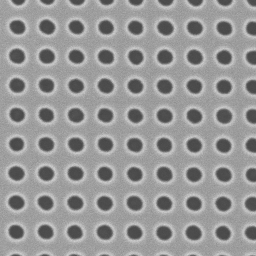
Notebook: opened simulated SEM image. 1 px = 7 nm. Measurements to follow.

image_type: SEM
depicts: a regular array of holes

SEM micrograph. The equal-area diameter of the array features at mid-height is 107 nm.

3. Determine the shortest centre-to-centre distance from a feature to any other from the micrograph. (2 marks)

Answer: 28.9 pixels